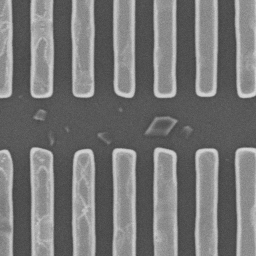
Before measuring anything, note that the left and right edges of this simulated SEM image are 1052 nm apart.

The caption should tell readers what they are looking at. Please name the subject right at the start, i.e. wiring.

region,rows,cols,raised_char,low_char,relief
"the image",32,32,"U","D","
UDDDUUDDDUUUDDUUUDDDUUDDDUUDDDUU
UDDDUUDDDUUUDDUUUDDUUUDDDUUDDDUU
UDDDUUDDDUUUDDUUUDDUUUDDDUUDDDUU
UDDDUUDDDUUUDDUUUDDDUUDDDUUDDDUU
UDDDUUDDDUUUDDUUUDDDUUDDDUUDDDUU
UDDDUUDDDUUUDDUUUDDDUUDDDUUDDDUU
UDDDUUDDDUUUDDDUUDDDUUDDDUUDDDUU
UDDDUUDDDUUUDDDUUDDUUUDDDUUDDDUU
UDDDUUDDDUUUDDDUUDDDUUDDDUUDDDUU
UDDDUUDDDUUUDDDUUDDDUUDDDUUDDDUU
UDDDUUDDDUUDDDDUUDDDUUDDDUUDDDUU
UDDDUUDDDDUDDDDUUDDDUUDDDUUDDDUU
DDDDDDDDDDDDDDDDDDDDDDDDDDDDDDDD
DDDDDDDDDDDDDDDDDDDDDDDDDDDDDDDD
DDDDDDDDDDDDDDDDDDDDDDDDDDDDDDDD
DDDDDDDDDDDDDDDDDDDDDDDDDDDDDDDD
DDDDDDDDDDDDDDDDDDDDDDDDDDDDDDDD
DDDDDDDDDDDDDDDDDDDDDDDDDDDDDDDD
DDDDDDDDDDDDDDDDDDDDDDDDDDDDDDDD
UDDDUUDDDDUUDDUUUDDDUUDDDUUDDDUU
UDDDUUDDDUUUDDUUUDDDUUDDDUUDDDUU
UDDDUUDDDUUUDDUUUDDDUUDDDUUDDDUU
UDDDUUDDDUUUDDUUUDDDUUDDDUUDDDUU
UDDDUUDDDUUUDDUUUDDUUUDDDUUDDDUU
UDDDUUDDDUUUDDDUUDDUUUDDDUUDDDUU
UDDDUUDDDUUUDDUUUDDUUUDDDUUDDDUU
UDDDUUDDDUUUDDUUUDDDUUDDDUUDDDUU
UDDDUUDDDUUUDDUUUDDUUUDDDUUDDDUU
UDDDUUDDDUUUDDDUUDDUUUDDDUUDDDUU
UDDDUUDDDUUUDDUUUDDDUUDDDUUDDDUU
UDDDUUDDDUUUDDUUUDDDUUDDDUUDDDUU
UDDDUUDDDUUUDDUUUDDDUUDDDUUDDDUU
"